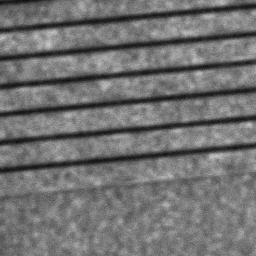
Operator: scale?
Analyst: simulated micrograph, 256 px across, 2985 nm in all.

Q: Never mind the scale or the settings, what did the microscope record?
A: parallel lines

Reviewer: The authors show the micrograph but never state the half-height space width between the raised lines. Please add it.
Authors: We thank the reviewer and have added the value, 6.22 pixels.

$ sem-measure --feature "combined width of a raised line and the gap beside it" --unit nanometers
325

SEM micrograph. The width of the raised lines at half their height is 248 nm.